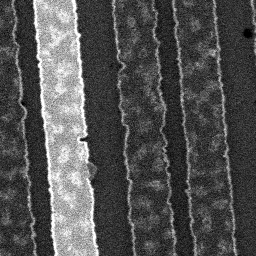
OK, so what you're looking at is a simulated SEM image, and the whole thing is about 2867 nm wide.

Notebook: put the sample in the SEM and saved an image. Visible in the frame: one or a few lines or trenches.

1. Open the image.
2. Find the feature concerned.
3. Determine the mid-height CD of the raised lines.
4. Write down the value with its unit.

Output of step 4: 0.459 microns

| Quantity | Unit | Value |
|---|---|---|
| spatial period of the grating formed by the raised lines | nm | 777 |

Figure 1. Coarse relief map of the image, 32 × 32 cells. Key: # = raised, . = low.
##..#####.....#####...#####....#
##..#####.....######..#####.....
##..######....######..#####.....
##...#####....#####...#####.....
##...#####.....####...#####.....
##...#####.....#####..#####.....
##...#####.....#####..#####.....
##...#####.....#####..#####.....
##...#####.....#####..######....
###..#####.....#####...#####....
###..#####.....#####...#####....
###..#####.....#####...#####....
###..#####.....#####...#####....
###..#####.....######..#####....
###..#####.....######..#####....
###...#####.....#####..#####....
###...#####.....####...#####....
###...####......#####..#####....
###...#####.....#####..#####....
###...#####.....#####..#####....
###...#####.....#####..######...
###...######....#####...#####...
####..#####.....#####..######...
####..#####.....#####..######...
####..######....#####...#####...
####...#####....#####...#####...
####...#####....######..#####...
####...#####....######..#####...
####...#####.....#####..#####...
####...#####.....#####..#####...
####...#####.....#####..#####...
####...#####.....#####..#####...